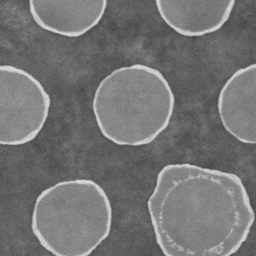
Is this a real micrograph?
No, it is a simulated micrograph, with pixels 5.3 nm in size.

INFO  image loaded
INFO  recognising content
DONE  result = raised bodies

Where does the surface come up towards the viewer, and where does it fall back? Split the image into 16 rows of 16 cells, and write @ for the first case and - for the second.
--@@@@----@@@@--
---@@@-----@@@--
----------------
----------------
@------@@@-----@
@@@---@@@@@---@@
@@@---@@@@@---@@
@@@---@@@@----@@
@@-----@@@-----@
----------------
-----------@----
----@@----@@@@@-
--@@@@@--@@@@@@-
--@@@@@--@@@@@@@
--@@@@@---@@@@@-
---@@@----@@@@@-